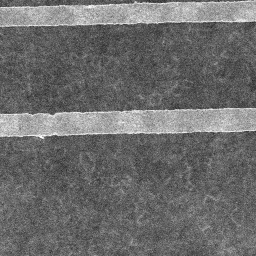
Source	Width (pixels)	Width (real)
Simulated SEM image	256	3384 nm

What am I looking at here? one or a few lines or trenches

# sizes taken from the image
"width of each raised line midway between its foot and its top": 20.7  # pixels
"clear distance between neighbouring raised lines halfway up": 1.16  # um